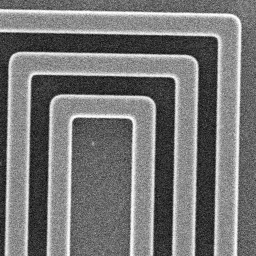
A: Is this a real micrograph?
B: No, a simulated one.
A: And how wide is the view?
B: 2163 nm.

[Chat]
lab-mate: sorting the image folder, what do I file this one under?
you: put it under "groups of lines, slits or small figures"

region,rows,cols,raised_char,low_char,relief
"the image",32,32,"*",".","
................................
************....................
******************************..
******************************..
..........................****..
...........................***..
...........................***..
.***********************...***..
.************************..***..
.***.................****..***..
.***..................***..***..
.***..................***..***..
.***...************...***..***..
.***..*************...***..***..
.***..*************...***..***..
.***..***........**...***..***..
.***..***........**...***..***..
.***..***........**...***..***..
.***..***........**...***..***..
.***..***........**...***..***..
.***..***........**...**...***..
.**...***........**...**...***..
.**...***........**...**...***..
.**...***........**...**...***..
.**...***........**...**...***..
.**...***........**...**...***..
.**...***........**...**...***..
.**...***........**...**...***..
.**...***........**...**...***..
.**...***.......***...**...***..
.**...***.......***...**...***..
.**...***.......***...**...***..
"